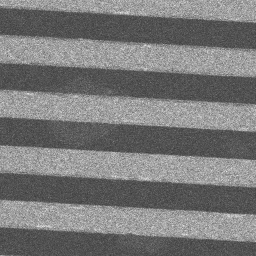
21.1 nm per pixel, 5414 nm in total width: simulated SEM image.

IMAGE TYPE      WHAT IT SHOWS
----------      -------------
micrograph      parallel lines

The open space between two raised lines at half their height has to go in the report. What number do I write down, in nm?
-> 541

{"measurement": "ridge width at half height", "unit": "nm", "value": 604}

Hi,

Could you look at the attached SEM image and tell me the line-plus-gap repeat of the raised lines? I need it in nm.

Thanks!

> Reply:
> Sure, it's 1160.